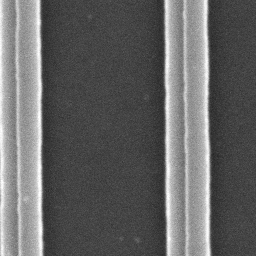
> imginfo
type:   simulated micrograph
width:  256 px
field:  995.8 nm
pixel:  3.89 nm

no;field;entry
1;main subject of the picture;lines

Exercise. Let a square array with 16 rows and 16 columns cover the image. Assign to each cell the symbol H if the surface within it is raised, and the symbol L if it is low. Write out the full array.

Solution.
HHLLLLLLLLHHHLLL
HHLLLLLLLLHHHLLL
HHLLLLLLLLHHHLLL
HHLLLLLLLLHHHLLL
HHLLLLLLLLHHHLLL
HHLLLLLLLLHHHLLL
HHLLLLLLLLHHHLLL
HHLLLLLLLLHHHLLL
HHLLLLLLLLHHHLLL
HHLLLLLLLLHHHLLL
HHLLLLLLLLHHHLLL
HHLLLLLLLLHHHLLL
HHLLLLLLLLHHHLLL
HHLLLLLLLLHHHLLL
HHHLLLLLLLLHHLLL
HHHLLLLLLLLHHLLL